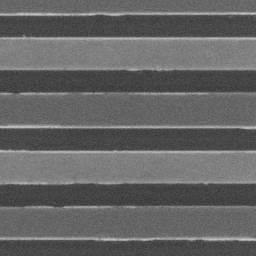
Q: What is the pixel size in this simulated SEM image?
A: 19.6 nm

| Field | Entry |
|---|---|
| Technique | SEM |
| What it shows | lines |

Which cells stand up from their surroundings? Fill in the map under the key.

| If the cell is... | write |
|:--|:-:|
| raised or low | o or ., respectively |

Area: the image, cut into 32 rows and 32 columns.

oooooooooooooooooooooooooooooooo
oooooooooooooooooooooooooooooooo
................................
................................
................................
oooooooooooooooooooooooooooooooo
oooooooooooooooooooooooooooooooo
oooooooooooooooooooooooooooooooo
oooooooooooooooooooooooooooooooo
................................
................................
................................
oooooooooooooooooooooooooooooooo
oooooooooooooooooooooooooooooooo
oooooooooooooooooooooooooooooooo
oooooooooooooooooooooooooooooooo
................................
................................
................................
oooooooooooooooooooooooooooooooo
oooooooooooooooooooooooooooooooo
oooooooooooooooooooooooooooooooo
oooooooooooooooooooooooooooooooo
................................
................................
................................
oooooooooooooooooooooooooooooooo
oooooooooooooooooooooooooooooooo
oooooooooooooooooooooooooooooooo
oooooooooooooooooooooooooooooooo
................................
................................